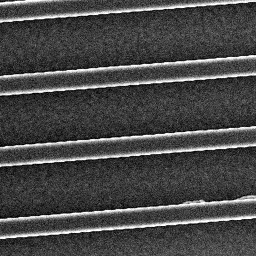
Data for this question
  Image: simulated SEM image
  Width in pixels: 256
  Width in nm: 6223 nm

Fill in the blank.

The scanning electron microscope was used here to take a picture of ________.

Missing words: lines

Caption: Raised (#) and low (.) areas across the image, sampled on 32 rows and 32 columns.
###########################.....
###############.................
###.............................
................................
................................
................................
................................
.........................#######
.............###################
##############################..
##################..............
######..........................
................................
................................
................................
................................
........................########
...........#####################
#############################...
#################...............
###.............................
................................
................................
................................
................................
.......................#########
...........#####################
#############################...
################................
####............................
................................
................................